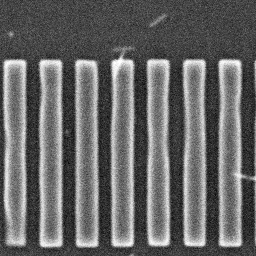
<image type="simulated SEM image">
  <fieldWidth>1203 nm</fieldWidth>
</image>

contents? groups of lines, slits or small figures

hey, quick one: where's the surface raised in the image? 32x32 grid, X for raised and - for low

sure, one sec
--------------------------------
--------------------------------
--------------------------------
--------------------------------
--------------------------------
--------------------------------
--------------------------------
--------------------------------
-XX--XXX--XX--XXX--XX--XXX--XX--
-XX--XXX--XX--XXX--XX--XXX--XX--
-XX--XXX--XX--XXX--XX--XX---XX--
-XX--XXX--XX--XXX--XX--XX---XX--
-XX--XXX--XX--XXX--XX--XX---XX--
-XX--XXX--XX--XXX--XX--XX---XX--
-XX--XXX--XX--XXX--XX--XX---XX--
-XX--XXX--XX--XXX--XX--XXX--XX--
-XX--XXX--XX--XXX--XX--XXX--XX--
-XX--XXX--XX--XX---XX--XXX--XX--
-XX--XXX--XX--XX---XX--XXX--XX--
-XX--XXX--XX--XX---XX--XXX-XXX--
-XX--XXX--XX--XX---XX--XXX-XXX--
-XX--XXX--XX--XX---XX--XXX-XXX--
-XX--XXX--XX--XXX--XX--XXX-XXX--
-XX--XXX--XX--XXX--XX--XXX-XXX--
-XX--XXX--XX--XXX--XX--XXX-XXX--
-XX--XXX--XX--XXX--XX--XXX--XX--
-XX--XXX--XX--XXX--XX--XXX--XX--
-XX--XXX--XX--XX---XX--XXX--XX--
-XX--XXX--XX--XX---XX--XXX--XX--
-XX--XXX--XX--XX---XX--XXX--XX--
-XX--XXX--XX--XX---XX---X---XX--
--------------------------------